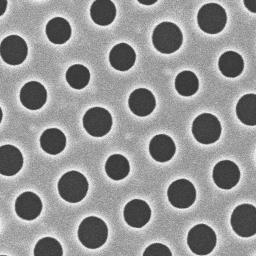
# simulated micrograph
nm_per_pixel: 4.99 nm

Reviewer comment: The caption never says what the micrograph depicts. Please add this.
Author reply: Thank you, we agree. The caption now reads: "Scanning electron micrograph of a regular array of holes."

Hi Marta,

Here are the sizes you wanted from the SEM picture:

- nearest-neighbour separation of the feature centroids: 242 nanometers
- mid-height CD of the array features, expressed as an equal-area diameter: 141 nm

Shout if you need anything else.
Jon